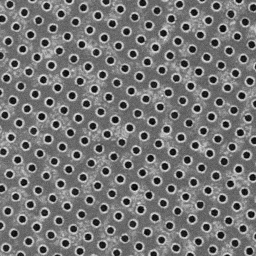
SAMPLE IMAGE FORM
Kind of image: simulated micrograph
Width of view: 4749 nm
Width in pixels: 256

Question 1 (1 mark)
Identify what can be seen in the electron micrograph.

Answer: a regular array of holes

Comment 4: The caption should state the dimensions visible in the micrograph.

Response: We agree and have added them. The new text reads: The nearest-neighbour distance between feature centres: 0.303 µm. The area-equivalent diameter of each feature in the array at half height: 0.143 µm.